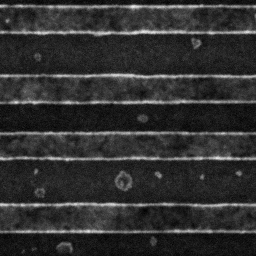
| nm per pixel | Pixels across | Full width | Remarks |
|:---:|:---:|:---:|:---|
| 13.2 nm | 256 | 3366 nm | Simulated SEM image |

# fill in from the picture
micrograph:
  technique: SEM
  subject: lines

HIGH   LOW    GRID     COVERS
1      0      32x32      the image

00000000000000000000000000000000
11111111111111111111111111111111
11111111111111111111111111111111
11111111111111111111111111111111
00000000000000000000000000000000
00000000000000000000000000000000
00000000000000000000000000000000
00000000000000000000000000000000
00000000000000000000000000000000
11111111111111111000101110100000
11111111111111111111111111111111
11111111111111111111111111111111
11111111111111111111111111111111
00000000000000000000000000000000
00000000000000000000000000000000
00000000000000000000000000000000
00000000000000000000000000000000
11111111111111111111111111111111
11111111111111111111111111111111
11111111111111111111111111111111
00000000000000000000000000000000
00000000000000000000000000000000
00000000000000000000000000000000
00000000000000000000000000000000
00000000000000000000000000000000
00000000100100000000100000000000
11111111111111111111111111111111
11111111111111111111111111111111
11111111111111111111111111111111
00000000000000000000000000000000
00000000000000000000000000000000
00000000000000000000000000000000